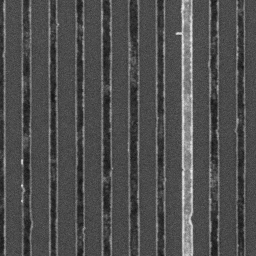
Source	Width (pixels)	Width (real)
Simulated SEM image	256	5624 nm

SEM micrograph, parallel lines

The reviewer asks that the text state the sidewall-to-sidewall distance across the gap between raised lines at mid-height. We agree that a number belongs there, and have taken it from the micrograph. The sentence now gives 406 nm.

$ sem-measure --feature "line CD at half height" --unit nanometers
192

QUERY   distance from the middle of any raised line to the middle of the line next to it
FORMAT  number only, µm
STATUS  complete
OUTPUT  0.588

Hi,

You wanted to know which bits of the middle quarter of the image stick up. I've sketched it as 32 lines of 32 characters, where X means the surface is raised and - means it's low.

---XX-----XX----XXX----XX-----XX
---XX-----XX----XXX----XX-----XX
---XX-----XX----XXX----XX-----XX
---XX-----XX----XXX----XX-----XX
---XX-----XX----XXX----XX-----XX
---XX-----XX----XXX----XX-----XX
---XX-----XX----XXX----XX-----XX
---XX-----XX----XXX----XX-----XX
---XX-----XX----XXX----XX-----XX
---XX-----XX----XXX----XX-----XX
---XX-----XX----XXX----XX-----XX
---XX-----XX----XXX----XX-----XX
---XX-----XX----XXX----XX-----XX
---XX-----XX----XXX----XX-----XX
---XX-----XX----XXX----XX-----XX
---XX-----XX----XXX----XX-----XX
---XX-----XX----XXX----XX-----XX
---XX-----XX----XXX----XX-----XX
---XX-----XX----XXX----XX-----XX
---XX-----XX----XXX----XX-----XX
---XX-----XX----XXX----XX-----XX
---XX-----XX----XXX----XX-----XX
---XX-----XX----XX-----XX-----XX
---XX-----XX----XX-----XX-----XX
---XX-----XX----XX-----XX-----XX
---XX-----XX----XX-----XX-----XX
---XX-----XX----XX-----XX-----XX
---XX-----XX----XX-----XX-----XX
---XX-----XX----XX-----XX-----XX
---XX-----XX----XX-----XX-----XX
---XX-----XX----XX-----XX-----XX
---XX-----XX----XX-----XX-----XX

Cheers